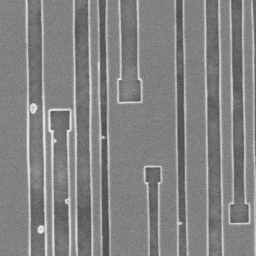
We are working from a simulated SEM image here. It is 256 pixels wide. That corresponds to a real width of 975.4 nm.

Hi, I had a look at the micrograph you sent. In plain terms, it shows groups of lines, slits or small figures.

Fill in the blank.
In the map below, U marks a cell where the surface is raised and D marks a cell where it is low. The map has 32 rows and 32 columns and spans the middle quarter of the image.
UUUDDDDUUDDUUUDDDDDUUUUUUUUUDDUU
UUUDDDDUUDDUUUDDDDDUUUUUUUUUDDUU
UUUDDDDUUDDUUUDDDDDUUUUUUUUUDDUU
UUUDDDDUUDDUUUDDDDDUUUUUUUUUDDUU
UUUDDDDUUDDUUDDDDDDUUUUUUUUUDDUU
UUUDDDDUUDDUUDDDDDDUUUUUUUUUDDUU
UUUDDDDUUDDUUDDDDDDUUUUUUUUUDDUU
UUUDDDDUUDDUUDDDDDDUUUUUUUUUDDUU
UUUDDDDUUDDUUUDDDDDUUUUUUUUUDDUU
UUUDDDDUUDDUUUDDDDDUUUUUUUUUDDUU
UUUDDDDUUDDUUUUUUUUUUUUUUUUUDDUU
DUUDDDDUUDDUUUUUUUUUUUUUUUUUDDUU
DDUDDDDUUDDUUUUUUUUUUUUUUUUUDDUU
DDUDDDDUUDDUUUUUUUUUUUUUUUUUDDUU
DDUDDDDUUDDUUUUUUUUUUUUUUUUUDDUU
DDUDDDDUUDDUUUUUUUUUUUUUUUUUDDUU
DUUDDDDUUDDUUUUUUUUUUUUUUUUUDDUU
DUUDDDDUUDDUUUUUUUUUUUUUUUUUDDUU
DUUDDDDUUDDUUUUUUUUUUUUUUUUUDDUU
DUUDDDDUUDDUUUUUUUUUUUUUUUUUDDUU
DUUDDDDUUDDUUUUUUUUUUUUUUUUUDDUU
DUUDDDDUUDDUUUUUUUUUUUUUUUUUDDUU
DUUDDDDUUDDUUUUUUUUUUUUUUUUUDDUU
DUUDDDDUUDDUUUUUUUUUUUUUUUUUDDUU
DUUDDDDUUDDUUUUUUUUUUUUUUUUUDDUU
DUUDDDDUUDDUUUUUUUUUUUUUUUUUDDUU
DUUDDDDUUDDUUUUUUUUUDDDDUUUUDDUU
DUUDDDDUUDDUUUUUUUUUDDDDUUUUDDUU
DUUDDDDUUDDUUUUUUUUUDDDDUUUUDDUU
DUUDDDDUUDDUUUUUUUUUDDDDUUUUDDUU
DUUDDDDUUDDUUUUUUUUUUDDDUUUUDDUU
DUUDDDDUUDDUUUUUUUUUUDDDUUUUDDUU